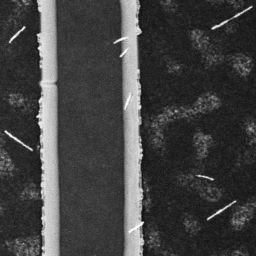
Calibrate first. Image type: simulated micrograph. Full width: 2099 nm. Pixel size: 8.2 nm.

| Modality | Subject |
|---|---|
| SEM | one or a few lines or trenches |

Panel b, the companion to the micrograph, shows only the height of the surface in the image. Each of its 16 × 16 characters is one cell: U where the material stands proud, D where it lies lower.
UUUDDDDDUUUUUUUU
UUUDDDDDUUUUUUUU
UUUDDDDDUUUUUUUU
UUUDDDDDUUUUUUUU
UUUDDDDDUUUUUUUU
UUUDDDDDUUUUUUUU
UUUDDDDDUUUUUUUU
UUUDDDDDUUUUUUUU
UUUDDDDDUUUUUUUU
UUUDDDDDUUUUUUUU
UUUDDDDDUUUUUUUU
UUUDDDDDUUUUUUUU
UUUDDDDDUUUUUUUU
UUUDDDDDUUUUUUUU
UUUDDDDDUUUUUUUU
UUUDDDDDUUUUUUUU